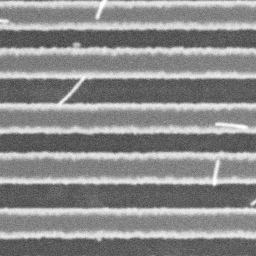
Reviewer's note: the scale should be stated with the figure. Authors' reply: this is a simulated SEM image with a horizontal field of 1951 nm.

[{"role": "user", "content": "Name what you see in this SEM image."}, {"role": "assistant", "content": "lines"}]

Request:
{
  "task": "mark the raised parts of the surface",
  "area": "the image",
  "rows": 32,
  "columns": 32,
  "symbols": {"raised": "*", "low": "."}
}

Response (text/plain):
********************************
********************************
********************************
.**..*..........................
................................
................................
********************************
********************************
********************************
.*.***.***.*.*.***.*******.*****
................................
................................
................................
********************************
********************************
********************************
................................
................................
................................
********************************
********************************
********************************
********************************
................................
................................
................................
********************************
********************************
********************************
*****.*************.*******.*.**
................................
................................